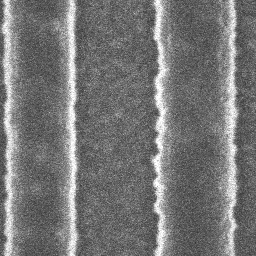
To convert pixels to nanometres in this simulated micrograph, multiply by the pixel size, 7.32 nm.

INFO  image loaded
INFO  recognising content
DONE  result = one or a few lines or trenches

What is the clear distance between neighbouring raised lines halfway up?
632 nm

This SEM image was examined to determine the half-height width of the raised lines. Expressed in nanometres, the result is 499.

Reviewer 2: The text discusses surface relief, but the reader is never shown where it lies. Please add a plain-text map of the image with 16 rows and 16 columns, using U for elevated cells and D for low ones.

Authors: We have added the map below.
UUUUUDDDDDUUUUUD
UUUUDDDDDDUUUUUD
UUUUUDDDDDUUUUUD
UUUUUDDDDDUUUUUD
UUUUUDDDDDUUUUUD
DUUUUDDDDDUUUUUD
DUUUUDDDDDUUUUUD
UUUUUDDDDDUUUUUD
DUUUUDDDDDUUUUDD
DUUUUDDDDDUUUUUD
DUUUUDDDDDUUUUUD
DUUUUDDDDDUUUUUD
DUUUUDDDDDUUUUUD
DUUUUDDDDDUUUUDD
DUUUUDDDDDUUUUUD
UUUUUDDDDDUUUUDD